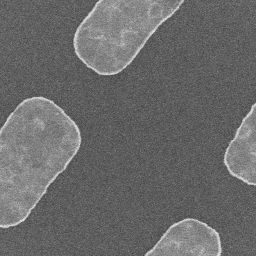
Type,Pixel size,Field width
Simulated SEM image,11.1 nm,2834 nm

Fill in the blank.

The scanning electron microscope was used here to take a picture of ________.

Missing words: raised bodies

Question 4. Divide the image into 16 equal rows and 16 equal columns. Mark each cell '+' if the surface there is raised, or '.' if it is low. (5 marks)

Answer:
......+++++.....
.....+++++......
.....++++.......
.....+++........
......+.........
................
.++.............
++++...........+
+++++..........+
+++++.........++
++++..........++
+++.............
++..............
++..............
..........+++...
..........++++..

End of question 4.